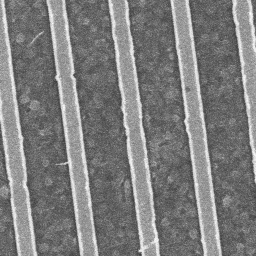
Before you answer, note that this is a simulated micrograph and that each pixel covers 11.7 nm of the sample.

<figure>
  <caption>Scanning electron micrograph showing one or a few lines or trenches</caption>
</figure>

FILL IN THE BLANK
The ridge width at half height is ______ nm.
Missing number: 193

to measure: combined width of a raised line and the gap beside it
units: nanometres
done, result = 716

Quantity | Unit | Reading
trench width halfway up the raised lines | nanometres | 526